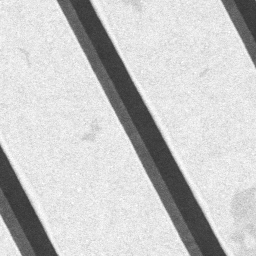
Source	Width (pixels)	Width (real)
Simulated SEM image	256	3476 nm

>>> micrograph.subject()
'lines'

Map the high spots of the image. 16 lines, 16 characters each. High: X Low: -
XXXX--XXXXXXXX--
XXXX--XXXXXXXXX-
XXXXX--XXXXXXXX-
XXXXX--XXXXXXXXX
XXXXXX--XXXXXXXX
XXXXXX---XXXXXXX
XXXXXXX--XXXXXXX
XXXXXXX---XXXXXX
XXXXXXXX--XXXXXX
XXXXXXXX---XXXXX
-XXXXXXXX--XXXXX
-XXXXXXXXX--XXXX
--XXXXXXXX--XXXX
--XXXXXXXXX--XXX
X--XXXXXXXX--XXX
X--XXXXXXXXX--XX